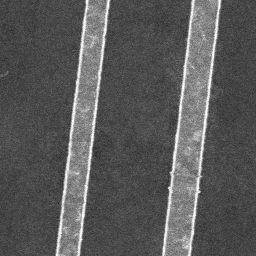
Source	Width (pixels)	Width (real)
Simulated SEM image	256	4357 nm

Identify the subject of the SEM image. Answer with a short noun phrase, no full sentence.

one or a few lines or trenches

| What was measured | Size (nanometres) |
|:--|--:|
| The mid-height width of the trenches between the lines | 1430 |